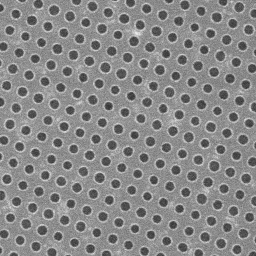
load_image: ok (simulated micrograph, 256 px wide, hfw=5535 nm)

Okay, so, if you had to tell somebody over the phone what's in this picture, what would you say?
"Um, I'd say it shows a regular array of holes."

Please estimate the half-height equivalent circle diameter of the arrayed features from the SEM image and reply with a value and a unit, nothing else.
10 px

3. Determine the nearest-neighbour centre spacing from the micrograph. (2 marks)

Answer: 368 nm